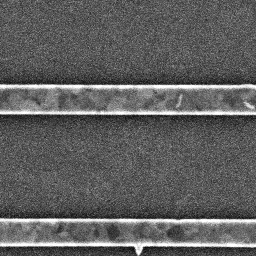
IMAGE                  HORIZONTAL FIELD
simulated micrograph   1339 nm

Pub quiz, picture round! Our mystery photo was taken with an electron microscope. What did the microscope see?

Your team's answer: one or a few lines or trenches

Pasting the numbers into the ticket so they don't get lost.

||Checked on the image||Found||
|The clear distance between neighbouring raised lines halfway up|558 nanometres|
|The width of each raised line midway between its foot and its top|141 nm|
